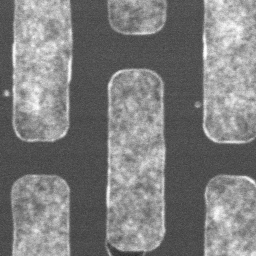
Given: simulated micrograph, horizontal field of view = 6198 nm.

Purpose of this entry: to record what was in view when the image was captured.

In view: holes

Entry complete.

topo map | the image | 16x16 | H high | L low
HLLLHHHLLLHHHLLL
HLLLHHHLLLHHHLLL
HLLLHHHHHHHHHLLL
HLLLHHHHHHHHHLLL
HLLLHHHHLHHHHLLL
HLLLHHHLLLHHHLLL
HLLLHHHLLLHHHLLL
HLLLHHHLLLHHHLLL
HLLLHHHLLLHHHLLL
HHHHHHHLLLHHHHHH
HHHHHHHLLLHHHHHH
HLLLHHHLLLHHHLLL
HLLLHHHLLLHHHLLL
HLLLHHHLLLHHHLLL
HLLLHHHLLLHHHLLL
HLLLHHHLLHHHHLLL